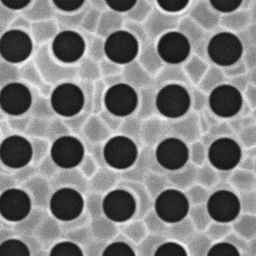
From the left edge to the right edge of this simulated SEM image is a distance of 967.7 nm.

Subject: a regular array of holes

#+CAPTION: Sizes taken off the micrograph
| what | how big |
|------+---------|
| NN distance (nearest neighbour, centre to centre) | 0.197 microns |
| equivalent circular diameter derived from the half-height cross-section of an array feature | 126 nanometers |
